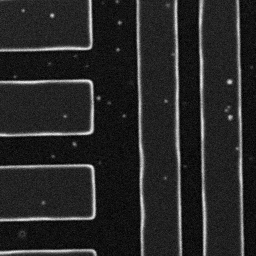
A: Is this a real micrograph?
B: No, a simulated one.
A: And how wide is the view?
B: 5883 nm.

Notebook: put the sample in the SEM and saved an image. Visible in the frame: groups of lines, slits or small figures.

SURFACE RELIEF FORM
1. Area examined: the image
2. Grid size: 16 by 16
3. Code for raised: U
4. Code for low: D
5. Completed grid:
UUUUUUDDDUUDDUUD
UUUUUUDDDUUDUUUD
UUUUUUDDDUUDUUUD
DDDDDDDDDUUDDUUD
DDDDDDDDDUUDDUUD
UUUUUUDDDUUDDUUD
UUUUUUDDDUUDDUUD
UUUUUUDDDUUDDUUD
DDDDDDDDDUUDDUUD
DDDDDDDDDUUDDUUD
UUUUUUDDDUUDDUUD
UUUUUUDDDUUDDUUD
UUUUUUDDDUUDDUUD
UUUUUUDDDUUDDUUD
DDDDDDDDDUUDDUUD
DDDDDDDDDUUDDUUD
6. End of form